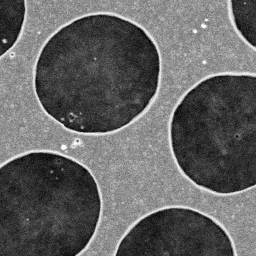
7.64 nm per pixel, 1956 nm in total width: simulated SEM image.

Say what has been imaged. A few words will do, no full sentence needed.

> holes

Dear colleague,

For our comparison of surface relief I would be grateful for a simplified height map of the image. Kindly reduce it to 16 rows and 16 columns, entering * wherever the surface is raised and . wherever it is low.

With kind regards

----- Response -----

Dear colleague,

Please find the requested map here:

..************..
.***....*******.
.**......******.
**........******
**........******
**........**....
***......**.....
****....***.....
***********.....
***********.....
.....******.....
......******....
......**********
......***....***
......**......**
.....**........*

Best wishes